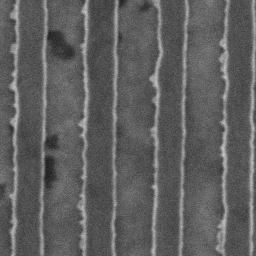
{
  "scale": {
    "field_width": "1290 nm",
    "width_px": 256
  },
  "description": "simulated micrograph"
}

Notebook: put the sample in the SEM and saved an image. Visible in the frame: lines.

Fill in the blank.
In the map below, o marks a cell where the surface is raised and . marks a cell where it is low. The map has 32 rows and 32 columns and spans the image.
..oooo.....oooo.....ooo.....oooo
..oooo.....oooo.....ooo.....oooo
..oooo.....oooo.....ooo.....oooo
..oooo.....oooo.....ooo.....oooo
..oooo.....oooo.....ooo.....oooo
..oooo.....oooo.....ooo.....oooo
..oooo.....ooo......ooo.....oooo
..oooo.....oooo.....ooo.....oooo
..oooo.....oooo.....ooo.....oooo
..oooo.....oooo....oooo.....oooo
..oooo.....ooo.....oooo.....oooo
..oooo.....ooo......ooo.....oooo
..oooo.....ooo......ooo.....oooo
..oooo.....ooo......ooo.....oooo
..oooo.....ooo.....oooo.....oooo
..oooo.....ooo.....oooo.....oooo
..oooo....oooo.....oooo.....oooo
..oooo.....ooo.....oooo.....oooo
..ooo......ooo.....oooo.....oooo
..ooo.....oooo.....oooo.....oooo
..ooo......ooo.....oooo.....oooo
..ooo.....oooo.....oooo.....oooo
..ooo......ooo.....oooo.....oooo
..ooo.....oooo.....oooo.....oooo
..ooo.....oooo.....oooo.....oooo
..ooo.....oooo.....oooo.....oooo
..ooo.....oooo.....oooo.....oooo
..ooo......ooo.....oooo.....oooo
..ooo......ooo.....oooo.....oooo
..ooo......ooo.....oooo.....oooo
..ooo......ooo.....oooo.....oooo
..ooo.....oooo.....oooo.....oooo